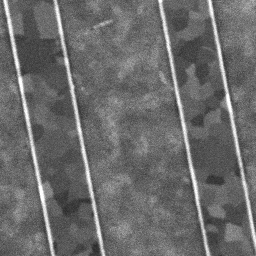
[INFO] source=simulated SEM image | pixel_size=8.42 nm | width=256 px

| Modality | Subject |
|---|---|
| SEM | one or a few lines or trenches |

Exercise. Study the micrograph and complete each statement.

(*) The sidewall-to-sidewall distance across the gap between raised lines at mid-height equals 862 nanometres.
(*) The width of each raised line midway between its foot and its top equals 414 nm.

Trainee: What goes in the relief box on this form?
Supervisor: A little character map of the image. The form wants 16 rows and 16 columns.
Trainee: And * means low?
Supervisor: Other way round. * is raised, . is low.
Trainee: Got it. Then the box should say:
****......***...
.***......***...
.***......****..
.***.......***..
.***.......***..
.***.......***..
..***......***..
..***......****.
..***.......***.
..***.......***.
..***.......***.
..****......***.
...***......***.
...***......****
...***.......***
...***.......***